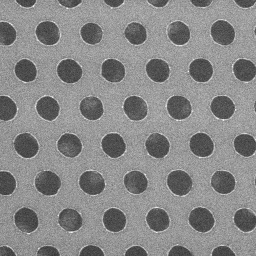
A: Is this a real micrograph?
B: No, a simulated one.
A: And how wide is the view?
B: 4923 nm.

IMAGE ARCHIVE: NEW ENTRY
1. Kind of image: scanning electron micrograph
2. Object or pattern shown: a regular array of raised bodies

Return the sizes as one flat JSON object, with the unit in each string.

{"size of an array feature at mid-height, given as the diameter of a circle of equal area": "485 nm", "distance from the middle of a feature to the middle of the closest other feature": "826 nanometers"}